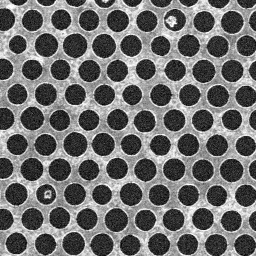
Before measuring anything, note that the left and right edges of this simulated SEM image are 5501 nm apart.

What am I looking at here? a regular array of holes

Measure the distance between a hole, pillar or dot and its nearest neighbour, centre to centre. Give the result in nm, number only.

600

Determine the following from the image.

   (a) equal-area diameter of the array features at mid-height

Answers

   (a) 0.484 um